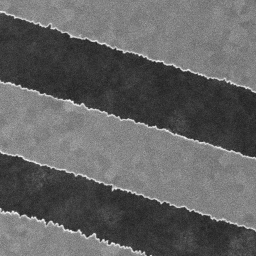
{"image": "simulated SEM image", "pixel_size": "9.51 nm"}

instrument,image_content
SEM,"one or a few lines or trenches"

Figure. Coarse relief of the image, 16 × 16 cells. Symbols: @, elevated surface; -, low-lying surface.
@@@@@@@@@@@@@@@@
--@@@@@@@@@@@@@@
------@@@@@@@@@@
---------@@@@@@@
------------@@@@
@@-------------@
@@@@@-----------
@@@@@@@@--------
@@@@@@@@@@@-----
@@@@@@@@@@@@@@@-
---@@@@@@@@@@@@@
-------@@@@@@@@@
----------@@@@@@
@@-----------@@@
@@@@@-----------
@@@@@@@@--------